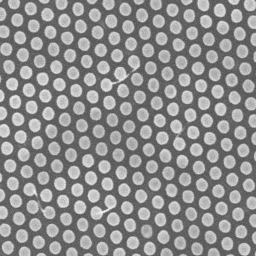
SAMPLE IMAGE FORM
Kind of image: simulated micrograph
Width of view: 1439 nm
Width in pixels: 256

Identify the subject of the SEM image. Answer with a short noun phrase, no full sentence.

a regular array of raised bodies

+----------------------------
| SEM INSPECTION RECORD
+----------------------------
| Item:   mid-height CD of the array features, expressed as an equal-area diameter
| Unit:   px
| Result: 12.2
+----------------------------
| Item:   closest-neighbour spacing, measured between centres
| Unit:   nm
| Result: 98.3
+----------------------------